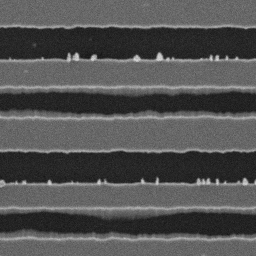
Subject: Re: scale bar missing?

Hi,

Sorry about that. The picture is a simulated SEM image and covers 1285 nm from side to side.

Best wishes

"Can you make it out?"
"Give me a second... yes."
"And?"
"lines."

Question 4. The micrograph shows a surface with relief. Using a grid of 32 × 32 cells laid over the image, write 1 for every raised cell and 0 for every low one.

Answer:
11111111111111111111111111111111
11111111111111111111111111111111
11111111111111111111111111111111
00000100100000000000000000000010
00000000000000000000000000000000
00000000000000000000000000000000
00000000000000000000000000000000
01011111111111111111111111111111
11111111111111111111111111111111
11111111111111111111111111111111
11111111111111111111111111111111
00000000000000000000000000000000
00000000000000000000000000000000
00000000000000000000000000000000
00011000000000000010001011100000
11111111111111111111111111111111
11111111111111111111111111111111
11111111111111111111111111111111
11111111111111111111111111111111
00000000000000000000000000000000
00000000000000000000000000000000
00000000000000000000000000000000
00000000000000000000000000000000
11111111111111111111111111111111
11111111111111111111111111111111
11111111111111111111111111111111
00000000000000000000000000000000
00000000000000000000000000000000
00000000000000000000000000000000
00000000000000000000000000000000
11111111111111111111111111111111
11111111111111111111111111111111